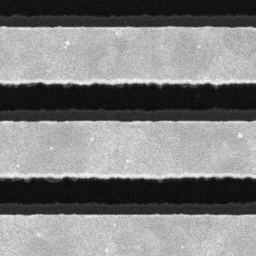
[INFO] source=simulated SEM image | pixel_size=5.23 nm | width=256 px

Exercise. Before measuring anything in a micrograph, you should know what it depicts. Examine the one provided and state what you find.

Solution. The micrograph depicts lines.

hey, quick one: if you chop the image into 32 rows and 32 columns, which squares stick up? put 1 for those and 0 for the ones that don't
00000000000000000000000000000000
00000000000000000000000000000000
00000000000000000000000000000000
11111111111111111111111111111111
11111111111111111111111111111111
11111111111111111111111111111111
11111111111111111111111111111111
11111111111111111111111111111111
11111111111111111111111111111111
11111111111111111111111111111111
11111011111101111011111110111000
00000000000000000000000000000000
00000000000000000000000000000000
00000000000000000000000000000000
00000000000000000000000000000000
11111111111111111111111111111111
11111111111111111111111111111111
11111111111111111111111111111111
11111111111111111111111111111111
11111111111111111111111111111111
11111111111111111111111111111111
11111111111111111111111111111111
01010011000000000000100000000000
00000000000000000000000000000000
00000000000000000000000000000000
00000000000000000000000000000000
00000000000000000000000000000000
11111111111111111111111111111111
11111111111111111111111111111111
11111111111111111111111111111111
11111111111111111111111111111111
11111111111111111111111111111111